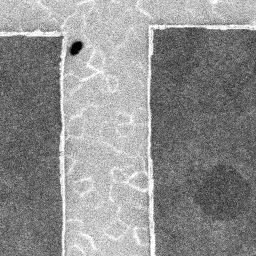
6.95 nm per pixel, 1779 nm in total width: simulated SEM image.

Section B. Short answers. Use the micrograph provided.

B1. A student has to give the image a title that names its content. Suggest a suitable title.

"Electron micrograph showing one or a few lines or trenches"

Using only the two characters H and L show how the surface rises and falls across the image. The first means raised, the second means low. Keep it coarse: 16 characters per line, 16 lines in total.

LLLLLLLLLLLLLLLL
LLLLLLLLLLLLLLLL
HHHHLLLLLHHHHHHH
HHHHLLLLLHHHHHHH
HHHHLLLLLHHHHHHH
HHHHLLLLLHHHHHHH
HHHHLLLLLHHHHHHH
HHHHLLLLLHHHHHHH
HHHHLLLLLHHHHHHH
HHHHLLLLLHHHHHHH
HHHHLLLLLHHHHHHH
HHHHLLLLLHHHHHHH
HHHHLLLLLHHHHHHH
HHHHLLLLLHHHHHHH
HHHHLLLLLHHHHHHH
HHHHLLLLLHHHHHHH